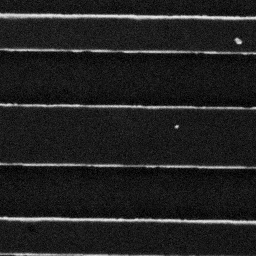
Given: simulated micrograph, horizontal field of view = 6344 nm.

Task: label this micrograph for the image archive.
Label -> lines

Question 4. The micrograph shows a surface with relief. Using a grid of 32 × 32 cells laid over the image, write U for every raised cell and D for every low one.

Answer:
DDDDDDDDDDDDDDDDDDDDDDDDDDDDDDDD
DDDDDDDDDDDDDDDDDDDDDDDDDDDDDDDD
UUUUUUUUUUUUUUUUUUUUUUUUUUUUUUUU
UUUUUUUUUUUUUUUUUUUUUUUUUUUUUUUU
UUUUUUUUUUUUUUUUUUUUUUUUUUUUUUUU
UUUUUUUUUUUUUUUUUUUUUUUUUUUUUUUU
DDDDDDDDDDDDDDDUUUUUUUUUUUUUUUUU
DDDDDDDDDDDDDDDDDDDDDDDDDDDDDDDD
DDDDDDDDDDDDDDDDDDDDDDDDDDDDDDDD
DDDDDDDDDDDDDDDDDDDDDDDDDDDDDDDD
DDDDDDDDDDDDDDDDDDDDDDDDDDDDDDDD
DDDDDDDDDDDDDDDDDDDDDDDDDDDDDDDD
DDDDDDDDDDDDDDDDDDDDDDDDDDDDDDDD
UUUUUUUUUUUUUUUUUUUUUUUUUUUUUUUU
UUUUUUUUUUUUUUUUUUUUUUUUUUUUUUUU
UUUUUUUUUUUUUUUUUUUUUUUUUUUUUUUU
UUUUUUUUUUUUUUUUUUUUUUUUUUUUUUUU
UUUUUUUUUUUUUUUUUUUUUUUUUUUUUUUU
UUUUUUUUUUUUUUUUUUUUUUUUUUUUUUUU
UUUUUUUUUUUUUUUUUUUUUUUUUUUUUUUU
UUUUUUUUUUUUUUUUUUUUUUUUUUUUUUUU
DDDDDDDDDDDDDDDDDDDDDDDDDDDDDDDD
DDDDDDDDDDDDDDDDDDDDDDDDDDDDDDDD
DDDDDDDDDDDDDDDDDDDDDDDDDDDDDDDD
DDDDDDDDDDDDDDDDDDDDDDDDDDDDDDDD
DDDDDDDDDDDDDDDDDDDDDDDDDDDDDDDD
DDDDDDDDDDDDDDDDDDDDDDDDDDDDDDDD
UUUUUUUUUDDUDDDDDDDDDDDDDDDDDDDD
UUUUUUUUUUUUUUUUUUUUUUUUUUUUUUUU
UUUUUUUUUUUUUUUUUUUUUUUUUUUUUUUU
UUUUUUUUUUUUUUUUUUUUUUUUUUUUUUUU
UUUUUUUUUUUUUUUUUUUUUUUUUUUUUUUU